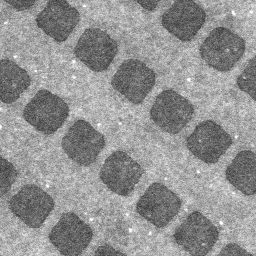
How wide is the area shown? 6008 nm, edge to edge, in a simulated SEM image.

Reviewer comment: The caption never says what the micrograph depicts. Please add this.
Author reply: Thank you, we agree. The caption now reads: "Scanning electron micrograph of a regular array of raised bodies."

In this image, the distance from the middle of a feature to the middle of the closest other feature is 1140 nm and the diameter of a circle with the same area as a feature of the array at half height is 1000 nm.